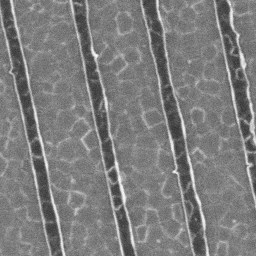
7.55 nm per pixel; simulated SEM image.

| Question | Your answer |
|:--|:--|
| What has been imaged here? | one or a few lines or trenches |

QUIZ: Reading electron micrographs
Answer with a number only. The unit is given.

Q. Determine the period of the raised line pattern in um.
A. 0.532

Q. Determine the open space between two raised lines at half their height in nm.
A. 425